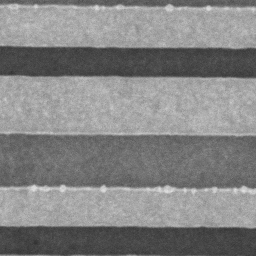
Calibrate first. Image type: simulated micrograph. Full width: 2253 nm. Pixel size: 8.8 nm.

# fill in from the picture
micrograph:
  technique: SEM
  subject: lines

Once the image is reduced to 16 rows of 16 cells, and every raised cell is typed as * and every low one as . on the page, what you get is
*********.**.*..
****************
****************
................
................
****************
****************
****************
................
................
................
................
****************
****************
................
................